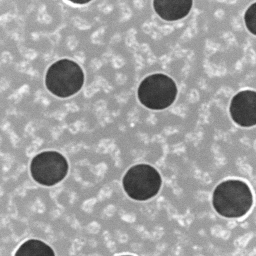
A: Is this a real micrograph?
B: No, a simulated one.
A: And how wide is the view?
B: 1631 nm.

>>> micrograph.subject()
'holes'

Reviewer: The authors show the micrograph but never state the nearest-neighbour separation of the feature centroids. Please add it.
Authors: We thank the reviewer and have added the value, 585 nm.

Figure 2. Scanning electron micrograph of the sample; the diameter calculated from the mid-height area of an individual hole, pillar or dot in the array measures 244 nanometers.